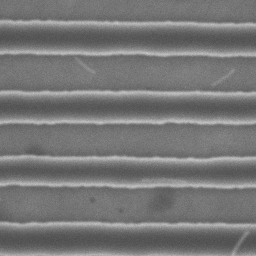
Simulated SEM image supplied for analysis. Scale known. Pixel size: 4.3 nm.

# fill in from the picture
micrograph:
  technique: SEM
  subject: lines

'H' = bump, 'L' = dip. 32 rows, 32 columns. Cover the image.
LLLLLLLLLLLLLLLLLLLLLLLLLLLLLLLL
LLLLLLLLLLLLLLLLLLLLLLLLLLLLLLLL
LLLLLLLLLLLLLLLLLLLLLLLLLLLLLLLL
HHHHHHHHHHHHHHHHHHHHHHHHHHHHHHHH
HHHHHHHHHHHHHHHHHHHHHHHHHHHHHHHH
HHHHHHHHHHHHHHHHHHHHHHHHHHHHHHHH
HHHHHHHHHHHHHHHHHHHHHHHHHHHHHHHH
LLLLLLLLLLLLLLLLLLLLLLLLLLLLLLLL
LLLLLLLLLLLLLLLLLLLLLLLLLLLLLLLL
LLLLLLLLLLLLLLLLLLLLLLLLLLLLLLLL
LLLLLLLLLLLLLLLLLLLLLLLLLLLLLLLL
HHHLLLLLLHHHHHLHHHHLLLLLLLLLLLLL
HHHHHHHHHHHHHHHHHHHHHHHHHHHHHHHH
HHHHHHHHHHHHHHHHHHHHHHHHHHHHHHHH
HHHHHHHHHHHHHHHHHHHHHHHHHHHHHHHH
LLLLLLLLLLLLLLLLLLLLLLLLLLLLLLLL
LLLLLLLLLLLLLLLLLLLLLLLLLLLLLLLL
LLLLLLLLLLLLLLLLLLLLLLLLLLLLLLLL
LLLLLLLLLLLLLLLLLLLLLLLLLLLLLLLL
LLHHHLLLLLLLLLLLLLLLLLLLLLLLLLLL
HHHHHHHHHHHHHHHHHHHHHHHHHHHHHHHH
HHHHHHHHHHHHHHHHHHHHHHHHHHHHHHHH
HHHHHHHHHHHHHHHHHHHHHHHHHHHHHHHH
LLLLLLLLLLLLLLLLLLLLLLLLLLLLLLLL
LLLLLLLLLLLLLLLLLLLLLLLLLLLLLLLL
LLLLLLLLLLLLLLLLLLLLLLLLLLLLLLLL
LLLLLLLLLLLLLLLLLLLLLLLLLLLLLLLL
LLLLLLLLLLLLLLLLLLLLLLLLLLLLLLLL
HHHHHHHHHHHHHHHHHHHHHHHHHHHHHHHH
HHHHHHHHHHHHHHHHHHHHHHHHHHHHHHHH
HHHHHHHHHHHHHHHHHHHHHHHHHHHHHHHH
HHHHHHHHHHHHHHHHHHHHHHHHHHHHHHHH